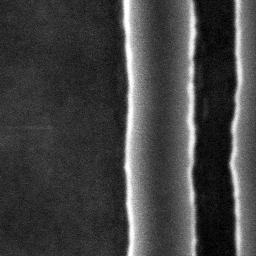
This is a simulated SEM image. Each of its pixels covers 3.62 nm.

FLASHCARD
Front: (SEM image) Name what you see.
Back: one or a few lines or trenches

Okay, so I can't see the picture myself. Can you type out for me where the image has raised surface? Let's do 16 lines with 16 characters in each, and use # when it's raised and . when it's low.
........####...#
........####...#
........####...#
........####...#
........####...#
........####...#
........####...#
........####...#
........####...#
........####...#
........####..##
........####...#
........####...#
........####...#
........####...#
........####...#